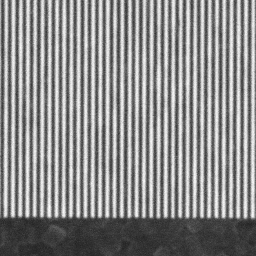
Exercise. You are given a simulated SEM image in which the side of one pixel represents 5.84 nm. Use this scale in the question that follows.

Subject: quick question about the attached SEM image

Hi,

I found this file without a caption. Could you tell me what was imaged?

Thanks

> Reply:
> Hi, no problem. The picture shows parallel lines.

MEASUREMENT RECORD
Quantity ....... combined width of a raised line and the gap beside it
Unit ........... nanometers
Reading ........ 42.5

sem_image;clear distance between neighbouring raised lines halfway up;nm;28.5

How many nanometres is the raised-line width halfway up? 16.8